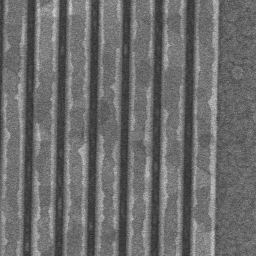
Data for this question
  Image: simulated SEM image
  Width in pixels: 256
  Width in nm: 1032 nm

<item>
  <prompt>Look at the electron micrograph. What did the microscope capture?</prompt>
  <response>parallel lines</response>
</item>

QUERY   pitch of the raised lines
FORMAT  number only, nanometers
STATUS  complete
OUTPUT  128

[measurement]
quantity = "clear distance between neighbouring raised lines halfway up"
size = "0.0433 micrometres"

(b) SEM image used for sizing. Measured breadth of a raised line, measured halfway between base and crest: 0.0867 microns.